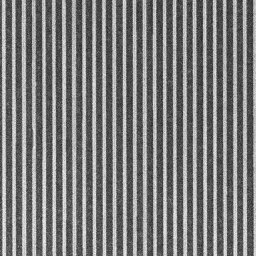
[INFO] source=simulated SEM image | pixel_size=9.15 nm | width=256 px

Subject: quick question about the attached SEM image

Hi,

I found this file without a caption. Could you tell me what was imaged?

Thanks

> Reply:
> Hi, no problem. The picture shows parallel lines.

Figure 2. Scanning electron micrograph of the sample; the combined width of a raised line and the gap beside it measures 10 pixels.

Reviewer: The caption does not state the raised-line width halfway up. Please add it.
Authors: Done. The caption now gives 24 nanometers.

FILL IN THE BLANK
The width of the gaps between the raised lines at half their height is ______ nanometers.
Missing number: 69.8